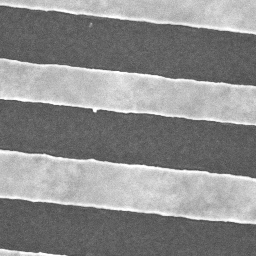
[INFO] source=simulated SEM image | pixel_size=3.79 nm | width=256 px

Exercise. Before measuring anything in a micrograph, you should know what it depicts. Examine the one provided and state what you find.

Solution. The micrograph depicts lines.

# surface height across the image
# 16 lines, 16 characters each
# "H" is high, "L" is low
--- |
LHHHHHHHHHHHHHHH
LLLLLLLLLLHHHHHH
LLLLLLLLLLLLLLLL
LLLLLLLLLLLLLLLL
HHHHHHHHLLLLLLLL
HHHHHHHHHHHHHHHH
LLLHHHHHHHHHHHHH
LLLLLLLLLLLLHHHH
LLLLLLLLLLLLLLLL
HLLLLLLLLLLLLLLL
HHHHHHHHHHLLLLLL
HHHHHHHHHHHHHHHH
LLHHHHHHHHHHHHHH
LLLLLLLLLLLHHHHH
LLLLLLLLLLLLLLLL
LLLLLLLLLLLLLLLL